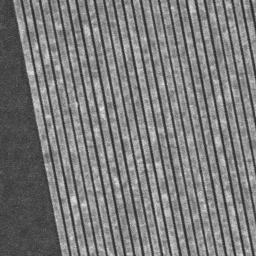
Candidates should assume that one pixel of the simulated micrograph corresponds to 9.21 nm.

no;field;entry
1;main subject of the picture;parallel lines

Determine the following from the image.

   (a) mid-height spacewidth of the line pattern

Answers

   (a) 3.56 px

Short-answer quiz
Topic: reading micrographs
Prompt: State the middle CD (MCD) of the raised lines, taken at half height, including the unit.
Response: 56.5 nanometres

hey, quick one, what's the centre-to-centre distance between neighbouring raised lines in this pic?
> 82.8 nanometres